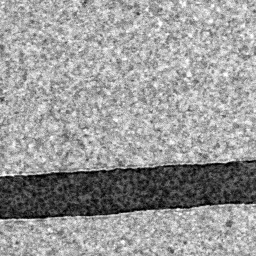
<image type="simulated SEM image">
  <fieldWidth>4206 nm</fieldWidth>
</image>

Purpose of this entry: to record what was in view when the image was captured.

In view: one or a few lines or trenches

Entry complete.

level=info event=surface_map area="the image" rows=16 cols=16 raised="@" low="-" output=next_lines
@@@@@@@@@@@@@@@@
@@@@@@@@@@@@@@@@
@@@@@@@@@@@@@@@@
@@@@@@@@@@@@@@@@
@@@@@@@@@@@@@@@@
@@@@@@@@@@@@@@@@
@@@@@@@@@@@@@@@@
@@@@@@@@@@@@@@@@
@@@@@@@@@@@@@@@@
@@@@@@@@@@@@@@@@
@@@@@@@@--------
----------------
----------------
------@@@@@@@@@@
@@@@@@@@@@@@@@@@
@@@@@@@@@@@@@@@@